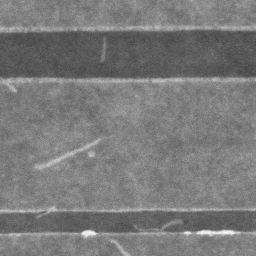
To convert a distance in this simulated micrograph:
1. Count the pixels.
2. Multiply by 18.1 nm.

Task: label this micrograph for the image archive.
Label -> lines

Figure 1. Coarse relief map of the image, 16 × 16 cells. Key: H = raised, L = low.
HHHHHHHHHHHHHHHH
HHHHHHHHHHHHHHHH
LLLLLLLLLLLLLLLL
LLLLLLLLLLLLLLLL
LLLLLLLLLLLLLLLL
HHHHHHHHHHHHHHHH
HHHHHHHHHHHHHHHH
HHHHHHHHHHHHHHHH
HHHHHHHHHHHHHHHH
HHHHHHHHHHHHHHHH
HHHHHHHHHHHHHHHH
HHHHHHHHHHHHHHHH
HHHHHHHHHHHHHHHH
HHHHHHHHHHHHHHHH
HHHHHHHHHHHHHHHH
HHHHHHHHHHHHHHHH